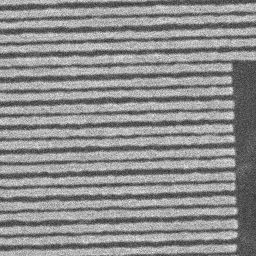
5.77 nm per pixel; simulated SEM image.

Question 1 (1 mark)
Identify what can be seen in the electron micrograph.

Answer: parallel lines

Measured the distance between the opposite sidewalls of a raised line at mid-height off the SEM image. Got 0.0375 micrometres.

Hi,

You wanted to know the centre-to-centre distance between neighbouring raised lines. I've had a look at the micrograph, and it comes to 69.2 nm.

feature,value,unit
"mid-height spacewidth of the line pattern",31.7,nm